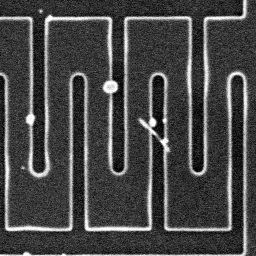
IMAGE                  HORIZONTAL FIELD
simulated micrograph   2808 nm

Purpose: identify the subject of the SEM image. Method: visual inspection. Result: groups of lines, slits or small figures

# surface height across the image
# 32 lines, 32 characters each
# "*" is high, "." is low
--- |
...............................*
...............................*
****..********..********..******
****..********..********..******
****..********..********..******
****..********..********..******
****..********..********..******
****..********..********..******
****..********..********..******
****..***.****..***.****..***.**
.***..***..***..***..***..***..*
.***..***..***..***..***..***..*
.***..***..***..***..***..***..*
.***..***..***..***..***..***..*
.***..***..***..***.****..***..*
.***..***..***..***.****..***..*
.***..***..***..***..***..***..*
.***..***..***..***.****..***..*
.***..***..***..***.****..***..*
.***..***..***..***..***..***..*
.***..***..***..***..***..***..*
.***..***..***.****..***.****..*
.********..********..********..*
.********..********..********..*
.********..********..********..*
.********..********..********..*
.********..********..********..*
.********..********..********..*
.********..********..********..*
...............................*
...............................*
..............................**